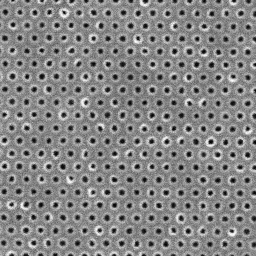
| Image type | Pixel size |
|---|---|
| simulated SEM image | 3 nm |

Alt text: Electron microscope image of a regular array of holes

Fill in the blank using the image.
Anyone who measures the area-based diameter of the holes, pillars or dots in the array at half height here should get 17.9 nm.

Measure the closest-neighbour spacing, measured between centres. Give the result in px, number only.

14.3